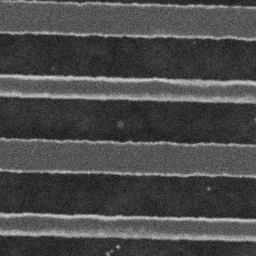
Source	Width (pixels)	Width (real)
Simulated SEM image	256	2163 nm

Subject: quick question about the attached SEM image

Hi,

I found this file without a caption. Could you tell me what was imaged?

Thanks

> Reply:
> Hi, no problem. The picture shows lines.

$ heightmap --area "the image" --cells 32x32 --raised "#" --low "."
###############.#...............
################################
################################
################################
.............###################
................................
................................
................................
................................
................................
################################
################################
................................
................................
................................
................................
................................
######..........................
################################
################################
################################
..#..###########################
................................
................................
................................
................................
................................
#############################...
################################
.....................###########
................................
................................